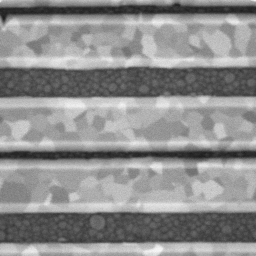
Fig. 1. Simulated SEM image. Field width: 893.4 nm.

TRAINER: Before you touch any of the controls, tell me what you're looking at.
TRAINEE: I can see one or a few lines or trenches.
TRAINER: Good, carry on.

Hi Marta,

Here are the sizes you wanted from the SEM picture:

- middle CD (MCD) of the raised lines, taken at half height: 158 nm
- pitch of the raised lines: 252 nm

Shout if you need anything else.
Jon